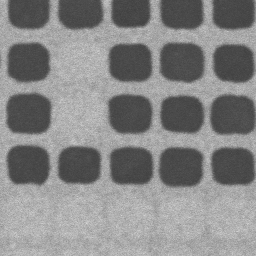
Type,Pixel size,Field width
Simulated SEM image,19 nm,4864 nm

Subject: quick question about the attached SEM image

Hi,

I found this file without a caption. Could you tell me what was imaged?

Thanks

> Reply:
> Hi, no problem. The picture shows a regular array of holes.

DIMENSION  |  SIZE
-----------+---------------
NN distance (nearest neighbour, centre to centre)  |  0.971 µm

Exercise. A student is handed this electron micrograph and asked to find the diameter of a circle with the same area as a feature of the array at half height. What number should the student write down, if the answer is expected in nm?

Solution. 837